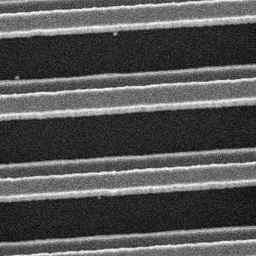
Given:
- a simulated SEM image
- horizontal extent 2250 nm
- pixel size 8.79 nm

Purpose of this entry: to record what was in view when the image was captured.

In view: lines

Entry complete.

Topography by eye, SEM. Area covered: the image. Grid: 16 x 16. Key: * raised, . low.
****************
***********.....
................
................
...........*****
****************
************....
................
................
.............***
****************
**************..
................
................
............****
****************